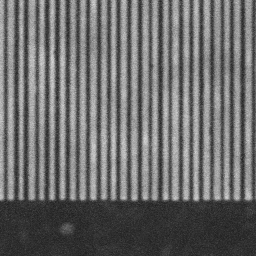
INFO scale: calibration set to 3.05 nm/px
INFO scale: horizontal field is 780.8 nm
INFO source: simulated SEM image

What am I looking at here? parallel lines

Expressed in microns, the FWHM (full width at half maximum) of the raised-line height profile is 0.016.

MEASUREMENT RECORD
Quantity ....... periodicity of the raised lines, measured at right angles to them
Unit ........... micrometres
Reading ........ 0.0315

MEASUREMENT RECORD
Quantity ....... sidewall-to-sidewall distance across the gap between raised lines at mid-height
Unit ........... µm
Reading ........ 0.016